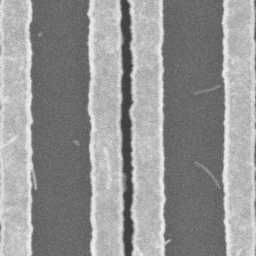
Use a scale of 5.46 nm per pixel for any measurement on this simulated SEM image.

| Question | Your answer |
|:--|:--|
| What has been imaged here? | lines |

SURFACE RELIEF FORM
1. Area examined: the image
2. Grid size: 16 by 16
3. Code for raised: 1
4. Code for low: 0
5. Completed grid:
1100001111000011
1100001111000011
1100001111000011
1100001111000011
1100001111000011
1100001111000011
1100001111000011
1100001111000011
1100001111000011
1100001111000011
1100001111000011
1100001111000011
1100001111000011
1100001111000011
1100001111000011
1100001111000011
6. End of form